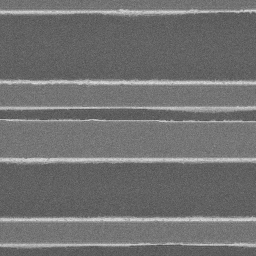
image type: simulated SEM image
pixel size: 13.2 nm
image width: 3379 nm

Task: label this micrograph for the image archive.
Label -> lines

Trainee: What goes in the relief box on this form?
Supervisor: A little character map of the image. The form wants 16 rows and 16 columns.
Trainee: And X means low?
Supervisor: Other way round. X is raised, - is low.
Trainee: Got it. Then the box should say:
XXXXXXXXXXXXXXXX
----------------
----------------
----------------
----------------
XXXXXXXXXXXXXXXX
XXXXXXXXXXXXXXXX
XXXXXXXXXXXXXXXX
XXXXXXXXXXXXXXXX
XXXXXXXXXXXXXXXX
----------------
----------------
----------------
----------------
XXXXXXXXXXXXXXXX
XXXXXXXXXXXXXXXX